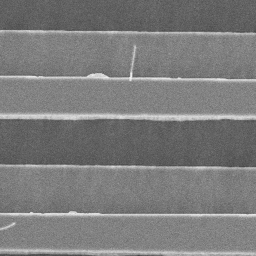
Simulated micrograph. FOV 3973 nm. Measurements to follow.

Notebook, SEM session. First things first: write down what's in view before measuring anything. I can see lines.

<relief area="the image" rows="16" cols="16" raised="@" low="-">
----------------
----------------
@@@@@@@@@@@@@@@@
@@@@@@@@@@@@@@@@
@@@@@@@@@@@@@@@@
@@@@@@@@@@@@@@@@
@@@@@@@@@@@@@@@@
----------------
----------------
----------------
@@@@@@@@@@@@@@@@
@@@@@@@@@@@@@@@@
@@@@@@@@@@@@@@@@
@@@@@@@@@@@@@@@@
@@@@@@@@@@@@@@@@
@@@@@@@@@@@@@@@@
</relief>